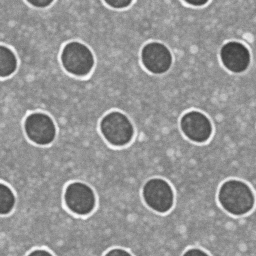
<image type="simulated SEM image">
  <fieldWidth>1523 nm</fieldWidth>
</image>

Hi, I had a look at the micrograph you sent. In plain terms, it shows a regular array of holes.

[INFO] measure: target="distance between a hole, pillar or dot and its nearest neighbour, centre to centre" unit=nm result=466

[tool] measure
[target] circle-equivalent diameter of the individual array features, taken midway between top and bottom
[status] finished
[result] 0.189 micrometres